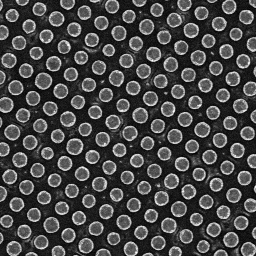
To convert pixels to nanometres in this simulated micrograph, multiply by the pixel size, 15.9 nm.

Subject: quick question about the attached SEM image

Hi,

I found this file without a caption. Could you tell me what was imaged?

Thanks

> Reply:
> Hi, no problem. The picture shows a regular array of raised bodies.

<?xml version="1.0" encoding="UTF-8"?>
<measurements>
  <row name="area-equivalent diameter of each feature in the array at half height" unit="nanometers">216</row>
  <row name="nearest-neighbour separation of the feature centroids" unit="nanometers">314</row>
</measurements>